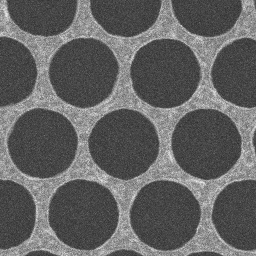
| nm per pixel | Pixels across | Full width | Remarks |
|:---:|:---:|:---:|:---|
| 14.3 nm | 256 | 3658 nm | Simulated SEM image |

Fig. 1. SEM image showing holes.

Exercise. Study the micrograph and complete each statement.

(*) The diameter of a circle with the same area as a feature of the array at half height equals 1020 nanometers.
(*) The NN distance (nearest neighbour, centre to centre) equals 1160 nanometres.